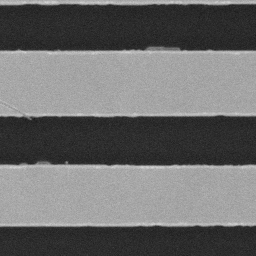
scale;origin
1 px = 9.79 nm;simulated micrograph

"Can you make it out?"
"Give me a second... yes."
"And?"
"lines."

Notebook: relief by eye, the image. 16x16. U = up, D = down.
DDDDDDDDDDDDDDDD
DDDDDDDDDDDDDDDD
DDDDDDDDDDDDDDDD
UUUUUUUUUUUUUUUU
UUUUUUUUUUUUUUUU
UUUUUUUUUUUUUUUU
UUUUUUUUUUUUUUUU
DDDDDDDDDDDDDDDD
DDDDDDDDDDDDDDDD
DDDDDDDDDDDDDDDD
UUUUUUUUUUUUUUUU
UUUUUUUUUUUUUUUU
UUUUUUUUUUUUUUUU
UUUUUUUUUUUUUUUU
DDDDDDDDDDDDDDDD
DDDDDDDDDDDDDDDD